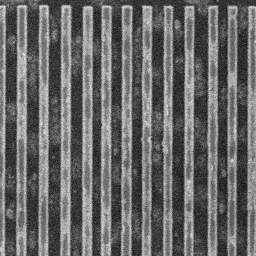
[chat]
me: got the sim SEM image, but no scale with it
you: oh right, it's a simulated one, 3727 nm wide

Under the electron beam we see parallel lines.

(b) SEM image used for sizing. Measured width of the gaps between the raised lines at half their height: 191 nm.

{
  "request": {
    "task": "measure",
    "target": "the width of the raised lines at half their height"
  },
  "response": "109 nm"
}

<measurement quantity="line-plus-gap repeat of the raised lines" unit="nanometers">306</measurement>